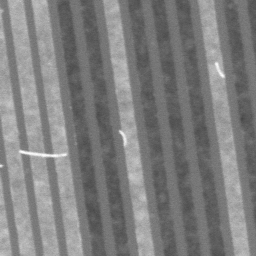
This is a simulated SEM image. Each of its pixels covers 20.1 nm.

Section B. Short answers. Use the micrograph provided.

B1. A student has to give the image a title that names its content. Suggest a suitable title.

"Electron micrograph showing parallel lines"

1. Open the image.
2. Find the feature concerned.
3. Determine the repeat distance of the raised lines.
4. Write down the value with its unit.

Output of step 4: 0.472 microns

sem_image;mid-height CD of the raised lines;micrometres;0.295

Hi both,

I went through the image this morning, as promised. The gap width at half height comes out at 9.04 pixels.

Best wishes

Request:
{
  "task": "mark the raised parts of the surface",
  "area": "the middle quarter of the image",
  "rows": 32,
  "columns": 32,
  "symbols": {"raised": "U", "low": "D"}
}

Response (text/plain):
UUUUDDUUUUDDUUUUDDUUUUDDUUUUDDUU
UUUUDDUUUUDDUUUUDDUUUUDDUUUUDDUU
DUUUDDDUUUDDDUUUDDUUUUDDUUUUDDUU
DUUUDDDUUUDDDUUUDDDUUUDDDUUUDDUU
DUUUDDDUUUDDDUUUDDDUUUDDDUUUDDDU
DUUUUDDUUUUDDUUUDDDUUUDDDUUUDDDU
DUUUUDDUUUUDDUUUUDDUUUUDDUUUDDDU
DUUUUDDUUUUDDUUUUDDUUUDDDUUUUDDU
DDUUUDDUUUUDDUUUUDDUUUUDDUUUUDDU
DDUUUDDDUUUDDDUUUDDUUUUDDUUUUDDU
DDUUUDDDUUUDDDUUUDDUUUUDDDUUUDDU
DDUUUDDDUUUDDDUUUDDDUUUDDDUUUDDD
DDUUUUDDUUUUDDUUUDDDUUUDDDUUUDDD
DDUUUUDDUUUUDDUUUUDDUUUUDDUUUDDD
DDUUUUDDUUUUDDUUUUDDUUUUDDUUUUDD
DDUUUUDDUUUUDDUUUUDDUUUUDDUUUUDD
DDDUUUDDDUUUDDDUUUDDUUUUDDUUUUDD
DDDUUUDDDUUUDDUUUUDDDUUUDDDUUUDD
DDDUUUDDDUUUUDDUUUDDDUUUDDDUUUDD
UDDUUUUDDUUUUDDUUUDDDUUUDDDUUUDD
UDDUUUUDDUUUUDDUUUUDDUUUUDDUUUDD
UDDUUUUDDUUUUDDUUUUDDUUUUDDUUUUD
UDDDUUUDDUUUUDDUUUUDDUUUUDDUUUUD
UDDDUUUDDDUUUDDDUUUDDUUUUDDUUUUD
UDDDUUUDDDUUUDDDUUUDDDUUUDDDUUUD
UDDDUUUDDDUUUDDDUUUDDDUUUDDDUUUD
UUDDUUUUDDUUUUDDUUUDDDUUUDDDUUUD
UUDDUUUUDDUUUUDDUUUUDDUUUUDDUUUD
UUDDUUUUDDUUUUDDUUUUDDUUUUDDUUUU
UUDDDUUUDDUUUUDDUUUUDDUUUUDDUUUU
UUDDDUUUDDDUUUDDDUUUDDUUUUDDUUUU
UUDDDUUUDDDUUUDDDUUUDDDUUUDDDUUU